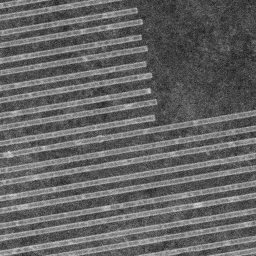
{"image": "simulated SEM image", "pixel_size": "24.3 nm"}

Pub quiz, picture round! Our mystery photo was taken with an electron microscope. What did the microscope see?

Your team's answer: parallel lines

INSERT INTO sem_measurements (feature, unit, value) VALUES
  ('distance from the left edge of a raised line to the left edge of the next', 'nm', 331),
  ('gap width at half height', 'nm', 247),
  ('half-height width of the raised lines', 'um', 0.114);